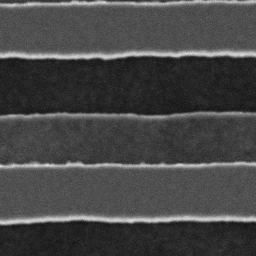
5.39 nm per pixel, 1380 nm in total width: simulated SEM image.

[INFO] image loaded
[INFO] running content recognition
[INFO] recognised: lines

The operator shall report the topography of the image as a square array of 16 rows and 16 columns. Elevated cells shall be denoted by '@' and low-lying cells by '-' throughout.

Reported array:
@@@@@@@@@@@@@@@@
@@@@@@@@@@@@@@@@
@@@@@@@@@@@@@@@@
@@@@@@@@--@-----
----------------
----------------
----------------
@@@@@@@@@@@@@@@@
@@@@@@@@@@@@@@@@
@@@@@@@@@@@@@@@@
@@@@@@@@@@@@@@@@
@@@@@@@@@@@@@@@@
@@@@@@@@@@@@@@@@
@@@@@@@@@@@@@@@@
----------------
----------------